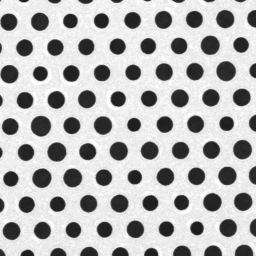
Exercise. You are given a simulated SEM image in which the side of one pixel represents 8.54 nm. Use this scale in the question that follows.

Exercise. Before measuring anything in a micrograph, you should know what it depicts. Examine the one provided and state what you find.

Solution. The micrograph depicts a regular array of holes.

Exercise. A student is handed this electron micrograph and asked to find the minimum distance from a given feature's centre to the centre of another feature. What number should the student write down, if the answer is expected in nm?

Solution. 257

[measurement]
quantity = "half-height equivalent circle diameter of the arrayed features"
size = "146 nanometers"